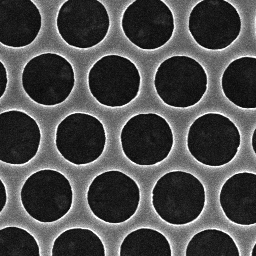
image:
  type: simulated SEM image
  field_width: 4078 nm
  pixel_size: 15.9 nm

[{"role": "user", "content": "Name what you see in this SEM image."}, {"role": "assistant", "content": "a regular array of holes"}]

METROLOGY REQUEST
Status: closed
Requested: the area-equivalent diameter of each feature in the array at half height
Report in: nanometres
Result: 834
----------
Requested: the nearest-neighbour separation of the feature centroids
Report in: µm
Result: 1.05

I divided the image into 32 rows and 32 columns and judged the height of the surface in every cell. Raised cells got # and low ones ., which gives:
....####.....###.....####....###
.....##......###.....###......##
.....##.......#.......##......##
.....##.......#.......##......##
.....###.....###.....###......##
....#####...#####...#####....###
################################
####....####....#####...#####...
.##......##......###.....###....
.##......##......##.......##....
.##......##......##.......##....
.##......##......###......##....
####....####.....###.....####...
###############################.
....####...######...#####...####
.....##......###.....###.....###
.....##......##......###......##
.....##......##.......#.......#.
.....##......##......###......##
....####....####.....###.....###
##.#######.######..#######..####
#####..######..######..#########
###.....####.....###.....###....
.##......##......##......###....
.##......##.......#.......##....
.##......##......##.......##....
###.....####.....###.....###....
#####..######...#####...#####...
#..#############################
....###.....####....####.....###
.....##......##......###.....###
.....#.......##......##.......#.